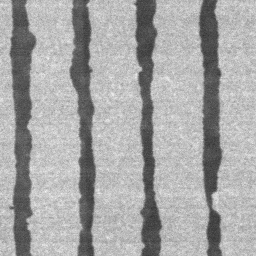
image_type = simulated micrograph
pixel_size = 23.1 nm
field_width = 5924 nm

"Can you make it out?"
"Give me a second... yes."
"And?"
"one or a few lines or trenches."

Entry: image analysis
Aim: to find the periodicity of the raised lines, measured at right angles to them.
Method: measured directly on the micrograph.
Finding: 1440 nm